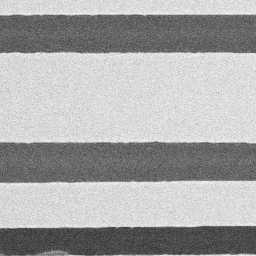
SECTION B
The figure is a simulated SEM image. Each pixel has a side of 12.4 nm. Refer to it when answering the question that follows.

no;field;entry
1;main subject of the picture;lines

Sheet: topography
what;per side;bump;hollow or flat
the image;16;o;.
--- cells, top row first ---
oooooooooooooooo
................
................
oooooooooooooooo
oooooooooooooooo
oooooooooooooooo
oooooooooooooooo
oooooooooooooooo
oooooooooooooooo
................
................
oooooooooooooooo
oooooooooooooooo
oooooooooooooooo
................
................